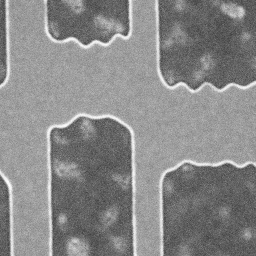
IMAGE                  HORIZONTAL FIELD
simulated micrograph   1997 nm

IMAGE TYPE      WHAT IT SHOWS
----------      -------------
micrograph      one or a few lines or trenches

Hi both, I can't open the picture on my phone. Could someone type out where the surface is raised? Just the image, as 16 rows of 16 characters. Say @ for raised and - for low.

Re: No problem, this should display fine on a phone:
@@@-----@@----@-
@@@-----@@------
@@@@@--@@@------
@@@@@@@@@@------
@@@@@@@@@@------
@@@@@@@@@@@@@@@@
@@@@@@@@@@@@@@@@
@@@@@--@@@@@@@@@
@@@-----@@@@@@@@
@@@-----@@@@@@@@
@@@-----@@@-----
@@@-----@@------
-@@-----@@------
-@@-----@@------
-@@-----@@------
-@@-----@@------